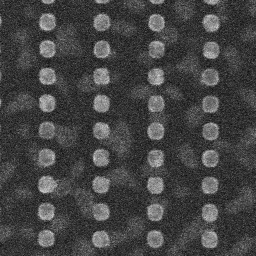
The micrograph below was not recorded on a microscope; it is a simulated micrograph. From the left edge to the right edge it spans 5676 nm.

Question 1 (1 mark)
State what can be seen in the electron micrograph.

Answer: a regular array of raised bodies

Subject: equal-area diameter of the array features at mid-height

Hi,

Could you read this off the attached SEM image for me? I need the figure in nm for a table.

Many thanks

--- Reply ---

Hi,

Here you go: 352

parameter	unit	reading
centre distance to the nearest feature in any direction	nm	596